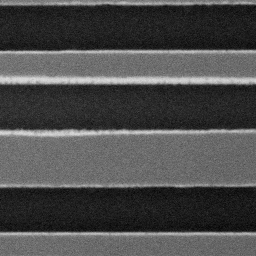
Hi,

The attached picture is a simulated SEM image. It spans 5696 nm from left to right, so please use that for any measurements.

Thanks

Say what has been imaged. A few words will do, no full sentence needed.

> lines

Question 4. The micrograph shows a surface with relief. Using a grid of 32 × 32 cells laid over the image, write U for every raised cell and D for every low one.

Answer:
UUUUUDDDDDDDDDDDDDDDDDDDDDDDDDDD
DDDDDDDDDDDDDDDDDDDDDDDDDDDDDDDD
DDDDDDDDDDDDDDDDDDDDDDDDDDDDDDDD
DDDDDDDDDDDDDDDDDDDDDDDDDDDDDDDD
DDDDDDDDDDDDDDDDDDDDDDDDDDDDDDDD
DDDDDDDDDDDDDDDDDDDDDDDDDDDDDDDD
UUUUUUUUUUUUUUUUUUUUUUUUUUUUUUUU
UUUUUUUUUUUUUUUUUUUUUUUUUUUUUUUU
UUUUUUUUUUUUUUUUUUUUUUUUUUUUUUUU
UUUUUUUUUUUUUUUUUUUUUUUUUUUUUUUU
DDDDDDDDDDDDDDDDDDDDDDDDDDDDDDDD
DDDDDDDDDDDDDDDDDDDDDDDDDDDDDDDD
DDDDDDDDDDDDDDDDDDDDDDDDDDDDDDDD
DDDDDDDDDDDDDDDDDDDDDDDDDDDDDDDD
DDDDDDDDDDDDDDDDDDDDDDDDDDDDDDDD
DDDDDDDDDDDDDDDDDDDDDDDDDDDDDDDD
UUUUUUUUUUUUUUUUUUUUUUUUUUUUUUUU
UUUUUUUUUUUUUUUUUUUUUUUUUUUUUUUU
UUUUUUUUUUUUUUUUUUUUUUUUUUUUUUUU
UUUUUUUUUUUUUUUUUUUUUUUUUUUUUUUU
UUUUUUUUUUUUUUUUUUUUUUUUUUUUUUUU
UUUUUUUUUUUUUUUUUUUUUUUUUUUUUUUU
UUUUUUUUUUUUUUUUUUUUUUUUUUUUUUUU
DDDDDDDDDDDDDDDDDDDDDDDDDDDDDDDD
DDDDDDDDDDDDDDDDDDDDDDDDDDDDDDDD
DDDDDDDDDDDDDDDDDDDDDDDDDDDDDDDD
DDDDDDDDDDDDDDDDDDDDDDDDDDDDDDDD
DDDDDDDDDDDDDDDDDDDDDDDDDDDDDDDD
DDDDDDDDDDDDDDDDDDDDDDDDDDDDDDDD
UUUUUUUUUUUUUUUUUUUUUUUUUUUUUUUU
UUUUUUUUUUUUUUUUUUUUUUUUUUUUUUUU
UUUUUUUUUUUUUUUUUUUUUUUUUUUUUUUU